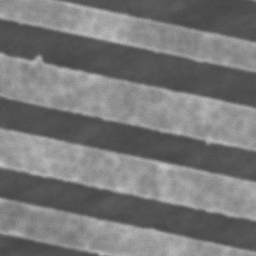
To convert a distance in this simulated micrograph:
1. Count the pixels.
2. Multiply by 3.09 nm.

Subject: one or a few lines or trenches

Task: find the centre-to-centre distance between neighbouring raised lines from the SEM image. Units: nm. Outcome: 216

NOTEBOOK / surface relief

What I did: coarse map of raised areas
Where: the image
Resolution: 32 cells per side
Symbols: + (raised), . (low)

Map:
+++++++++.......................
+++++++++++++...................
.+++++++++++++++++..............
......+++++++++++++++++.........
...........+++++++++++++++++....
................++++++++++++++++
....................++++++++++++
+++.+....................+++++++
++++++++......................++
++++++++++++....................
+++++++++++++++++...............
++++++++++++++++++++++..........
..+++++++++++++++++++++++++.....
.......++++++++++++++++++++++++.
............++++++++++++++++++++
.................+++++++++++++++
++...................+++++++++++
+++++++..................+++++++
+++++++++++....................+
++++++++++++++++................
++++++++++++++++++++............
....+++++++++++++++++++++.......
........++++++++++++++++++++++..
.............+++++++++++++++++++
..................++++++++++++++
+++...................++++++++++
++++++++...................+++++
++++++++++++....................
+++++++++++++++++...............
..++++++++++++++++++++..........
.......++++++++++++++++++++.....
............+++++++++++++++++++.